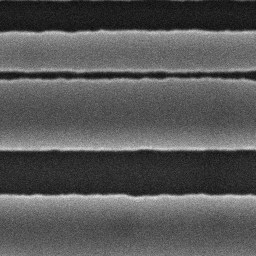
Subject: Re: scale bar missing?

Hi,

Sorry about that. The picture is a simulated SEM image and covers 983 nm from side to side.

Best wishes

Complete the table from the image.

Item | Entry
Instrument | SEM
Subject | lines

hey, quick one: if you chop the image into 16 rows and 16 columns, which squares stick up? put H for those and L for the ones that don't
LLLLLLLLLLLLLLLL
LLLLLLLLLLLLLLLL
HHHHHHHHHHHHHHHH
HHHHHHHHHHHHHHHH
HHHHHHHHHHHHHHHH
HHHHHHHHHHHHHHHH
HHHHHHHHHHHHHHHH
HHHHHHHHHHHHHHHH
HHHHHHHHHHHHHHHH
LLLLLLLLLLLLLLLL
LLLLLLLLLLLLLLLL
LLLLLLLLLLLLLLLL
HHHHHHHHHHHHHHHH
HHHHHHHHHHHHHHHH
HHHHHHHHHHHHHHHH
HHHHHHHHHHHHHHHH